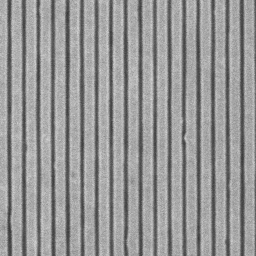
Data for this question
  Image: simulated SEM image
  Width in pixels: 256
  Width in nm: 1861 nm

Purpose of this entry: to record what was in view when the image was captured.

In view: parallel lines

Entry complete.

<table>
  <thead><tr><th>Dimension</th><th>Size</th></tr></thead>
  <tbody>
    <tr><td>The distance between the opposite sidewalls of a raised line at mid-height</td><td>69.9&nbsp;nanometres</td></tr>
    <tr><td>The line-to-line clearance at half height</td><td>34.5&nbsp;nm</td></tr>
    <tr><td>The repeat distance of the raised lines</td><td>14.5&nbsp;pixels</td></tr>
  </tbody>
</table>